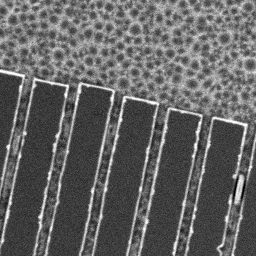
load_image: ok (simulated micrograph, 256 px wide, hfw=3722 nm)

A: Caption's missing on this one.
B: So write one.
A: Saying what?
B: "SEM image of parallel lines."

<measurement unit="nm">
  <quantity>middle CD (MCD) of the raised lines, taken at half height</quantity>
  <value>511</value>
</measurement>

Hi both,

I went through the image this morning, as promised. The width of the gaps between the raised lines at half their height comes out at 157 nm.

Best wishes